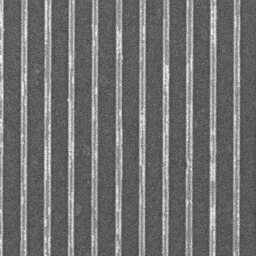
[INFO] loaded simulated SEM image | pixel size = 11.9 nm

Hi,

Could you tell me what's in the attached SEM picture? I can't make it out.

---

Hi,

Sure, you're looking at parallel lines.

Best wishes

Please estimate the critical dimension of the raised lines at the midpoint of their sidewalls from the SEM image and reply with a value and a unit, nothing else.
5.75 pixels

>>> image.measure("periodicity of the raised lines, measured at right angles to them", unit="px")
23.7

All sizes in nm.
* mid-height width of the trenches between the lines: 219